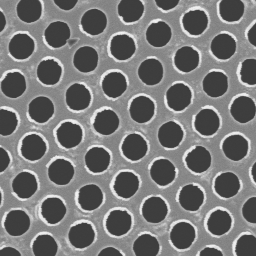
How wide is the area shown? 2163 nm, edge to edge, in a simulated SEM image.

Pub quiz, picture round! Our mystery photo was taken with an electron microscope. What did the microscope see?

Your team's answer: a regular array of holes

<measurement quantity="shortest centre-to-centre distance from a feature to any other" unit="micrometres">0.319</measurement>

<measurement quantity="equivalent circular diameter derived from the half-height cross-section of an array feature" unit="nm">217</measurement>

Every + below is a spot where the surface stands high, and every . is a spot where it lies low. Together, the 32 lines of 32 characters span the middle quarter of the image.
+++.....+++++++++++.....++++....
++++...++++++++++++......++++...
+++++++++++...++++.......+++++++
++++++++++.....++++.....++++++++
++++++++++......++++....++++++++
++...++++.......+++++++++++....+
+.....++++.....+++++++++++......
......++++.....+++++++++++......
.......+++++.+++++...+++++......
+......++++++++++.....++++......
+.....++++++++++.......+++.....+
+++.++++++..++++.......++++..+++
++++++++.....++++.....++++++++++
++++++++......+++.....++++++++++
+.++++++......++++..++++++..++++
....+++.......++++++++++.....+++
....++++.....+++++++++++......++
.....++++...+++++.++++++......++
....+++++++++++.....++++......++
....+++++++++++......+++.....+++
...+++++++++++.......++++...++++
++++++....++++.......+++++++++++
+++++......++++.....+++++++++++.
+++++.......++++...+++++++++++..
.++++......++++++++++++....+++..
..++++.....+++++++++++.....++++.
...++++...++++++++++++......++++
...+++++++++++...+++++......++++
..+++++++++++.....++++......++++
.++++++++++++......++++....+++++
+++++...++++.......+++++++++++..
++++.....++++.....+++++++++++...